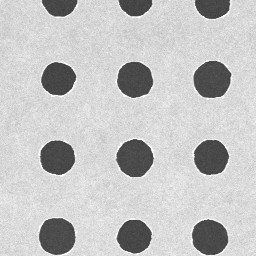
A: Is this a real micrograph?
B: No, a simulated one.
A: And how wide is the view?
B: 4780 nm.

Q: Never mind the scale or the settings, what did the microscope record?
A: a regular array of holes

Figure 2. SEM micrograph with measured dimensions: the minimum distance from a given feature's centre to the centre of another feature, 1430 nm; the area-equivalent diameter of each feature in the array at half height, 36.2 px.